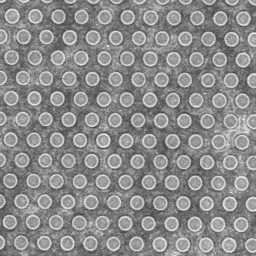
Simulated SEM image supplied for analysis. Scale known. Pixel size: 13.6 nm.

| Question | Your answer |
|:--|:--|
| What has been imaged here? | a regular array of raised bodies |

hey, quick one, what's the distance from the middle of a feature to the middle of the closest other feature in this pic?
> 313 nm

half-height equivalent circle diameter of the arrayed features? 186 nm